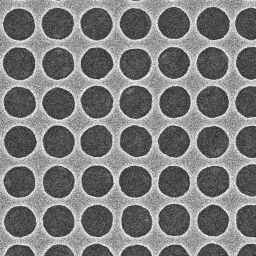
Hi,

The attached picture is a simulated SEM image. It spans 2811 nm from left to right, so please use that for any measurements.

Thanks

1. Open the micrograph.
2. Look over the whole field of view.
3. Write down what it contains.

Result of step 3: a regular array of holes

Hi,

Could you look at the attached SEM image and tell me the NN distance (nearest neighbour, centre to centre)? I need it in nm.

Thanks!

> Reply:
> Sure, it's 422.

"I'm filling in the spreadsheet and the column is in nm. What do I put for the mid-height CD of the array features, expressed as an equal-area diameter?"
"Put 355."